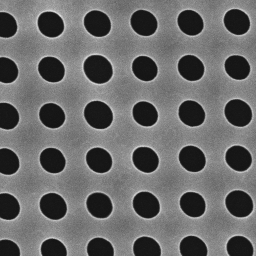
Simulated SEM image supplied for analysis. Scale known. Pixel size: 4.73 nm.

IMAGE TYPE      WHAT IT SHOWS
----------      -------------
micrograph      a regular array of holes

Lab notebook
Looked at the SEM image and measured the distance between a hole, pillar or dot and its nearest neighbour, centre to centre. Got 214 nm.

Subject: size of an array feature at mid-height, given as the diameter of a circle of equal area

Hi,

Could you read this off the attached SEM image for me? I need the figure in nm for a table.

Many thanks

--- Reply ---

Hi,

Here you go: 125